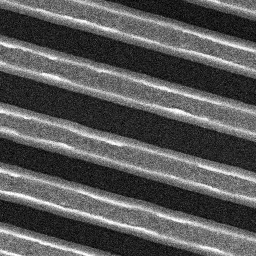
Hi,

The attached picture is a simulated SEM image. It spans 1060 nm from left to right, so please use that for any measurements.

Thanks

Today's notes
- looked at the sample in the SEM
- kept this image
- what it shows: parallel lines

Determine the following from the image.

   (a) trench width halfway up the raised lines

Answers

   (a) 0.141 micrometres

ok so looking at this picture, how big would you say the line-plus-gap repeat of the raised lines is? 255 nanometers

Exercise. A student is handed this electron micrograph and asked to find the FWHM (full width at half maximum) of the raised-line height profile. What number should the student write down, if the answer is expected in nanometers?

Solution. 111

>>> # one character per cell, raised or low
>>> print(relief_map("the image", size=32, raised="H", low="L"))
HHHHHHHHHHHHHLLLLLLLLLLLLLHHHHHH
LLLLHHHHHHHHHHHHLLLLLLLLLLLLLLHH
LLLLLLLHHHHHHHHHHHHHLLLLLLLLLLLL
LLLLLLLLLLLHHHHHHHHHHHHLLLLLLLLL
LLLLLLLLLLLLLLLHHHHHHHHHHHHLLLLL
HHLLLLLLLLLLLLLLLLHHHHHHHHHHHHHL
HHHHHHLLLLLLLLLLLLLLLLHHHHHHHHHH
HHHHHHHHHHLLLLLLLLLLLLLLLLHHHHHH
LHHHHHHHHHHHHLLLLLLLLLLLLLLLLHHH
LLLLHHHHHHHHHHHHHLLLLLLLLLLLLLLL
LLLLLLLLHHHHHHHHHHHHLLLLLLLLLLLL
LLLLLLLLLLLLHHHHHHHHHHHHLLLLLLLL
LLLLLLLLLLLLLLLHHHHHHHHHHHHHLLLL
HLLLLLLLLLLLLLLLLLLHHHHHHHHHHHHL
HHHHLLLLLLLLLLLLLLLLLLHHHHHHHHHH
HHHHHHHHLLLLLLLLLLLLLLLLLLHHHHHH
HHHHHHHHHHHLLLLLLLLLLLLLLLLLLLHH
LLLHHHHHHHHHHHHLLLLLLLLLLLLLLLLL
LLLLLLLHHHHHHHHHHHHLLLLLLLLLLLLL
LLLLLLLLLLLHHHHHHHHHHHLLLLLLLLLL
LLLLLLLLLLLLLLHHHHHHHHHHHHLLLLLL
HHHLLLLLLLLLLLLLLHHHHHHHHHHHHHLL
HHHHHHLLLLLLLLLLLLLLLHHHHHHHHHHH
HHHHHHHHHHLLLLLLLLLLLLLLLHHHHHHH
LHHHHHHHHHHHHLLLLLLLLLLLLLLLHHHH
LLLLHHHHHHHHHHHHHLLLLLLLLLLLLLLL
LLLLLLLLHHHHHHHHHHHHHLLLLLLLLLLL
LLLLLLLLLLLHHHHHHHHHHHHHLLLLLLLL
HLLLLLLLLLLLLLLHHHHHHHHHHHHHLLLL
HHHHLLLLLLLLLLLLLLLHHHHHHHHHHHHL
HHHHHHHHLLLLLLLLLLLLLLHHHHHHHHHH
HHHHHHHHHHHHLLLLLLLLLLLLLLHHHHHH